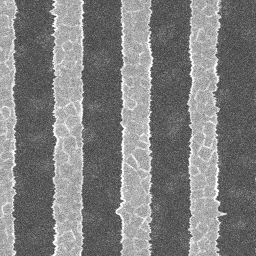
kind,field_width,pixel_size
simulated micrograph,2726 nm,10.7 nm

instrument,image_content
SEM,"one or a few lines or trenches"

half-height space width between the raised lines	429	nm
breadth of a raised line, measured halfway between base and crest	26.2	pixels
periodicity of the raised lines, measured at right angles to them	0.723	micrometres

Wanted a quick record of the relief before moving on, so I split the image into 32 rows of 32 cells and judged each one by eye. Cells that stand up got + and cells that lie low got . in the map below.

++.....+++.....++++.....+++.....
++.....+++.....++++.....+++.....
++.....+++.....++++.....+++.....
++.....+++.....++++.....+++.....
++.....+++.....++++.....+++.....
++.....+++.....++++.....+++.....
++.....+++.....++++.....+++.....
++.....+++.....++++.....+++.....
++.....+++.....++++.....+++.....
++.....+++.....++++.....+++.....
++.....+++.....++++.....+++.....
++.....+++.....++++.....+++.....
++.....+++.....++++.....+++.....
++.....+++.....++++.....+++.....
++.....+++.....++++.....+++.....
++.....+++.....++++.....+++.....
++.....+++.....++++.....+++.....
++.....+++.....++++.....+++.....
++.....+++.....++++.....+.+.....
++.....+++.....++++.....+++.....
++.....+++.....++++.....+++.....
++.....+++.....++++.....+++.....
++.....+++.....++++.....+++.....
++.....+++.....++++.....+++.....
++.....+++.....++++.....+++.....
++.....+++.....++++.....+++.....
++.....+++.....++++.....+++.....
++.....+++.....++++.....+++.....
++.....+++.....++++.....+++.....
++.....+++.....++++.....+++.....
++.....+++.....++++.....+++.....
++.....+++.....++++.....+++.....